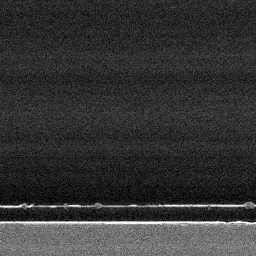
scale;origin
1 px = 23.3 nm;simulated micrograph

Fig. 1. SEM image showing lines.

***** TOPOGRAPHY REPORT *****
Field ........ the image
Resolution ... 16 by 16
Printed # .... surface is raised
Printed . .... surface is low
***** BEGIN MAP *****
................
................
................
................
................
................
................
................
................
................
................
................
................
################
################
################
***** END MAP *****